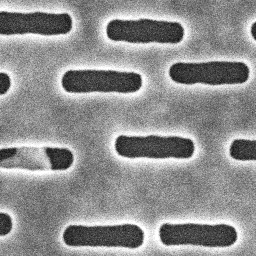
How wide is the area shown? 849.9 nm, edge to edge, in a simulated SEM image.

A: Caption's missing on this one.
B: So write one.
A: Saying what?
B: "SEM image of holes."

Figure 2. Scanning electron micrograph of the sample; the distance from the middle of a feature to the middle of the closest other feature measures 268 nanometres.